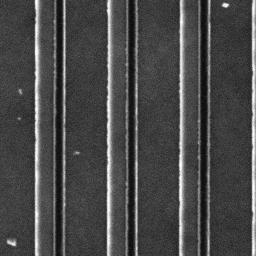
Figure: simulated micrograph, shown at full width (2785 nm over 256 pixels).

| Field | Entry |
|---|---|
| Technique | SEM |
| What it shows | lines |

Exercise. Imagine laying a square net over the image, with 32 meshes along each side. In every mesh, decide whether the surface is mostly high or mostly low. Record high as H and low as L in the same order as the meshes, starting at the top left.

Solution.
LLLLLHHHLLLLLLHHHLLLLLLHHHLLLLLL
LLLLLHHHLLLLLLHHHLLLLLLHHHLLLLLL
LLLLLHHHLLLLLLHHHLLLLLLHHHLLLLLL
LLLLHHHHLLLLLLHHHLLLLLLHHHLLLLLL
LLLLHHHHLLLLLLHHHLLLLLLHHHLLLLLL
LLLLHHHHLLLLLLHHHLLLLLLHHHLLLLLL
LLLLHHHHLLLLLLHHHLLLLLLHHHLLLLLL
LLLLLHHHLLLLLLHHHLLLLLLHHHLLLLLL
LLLLLHHHLLLLLLHHHLLLLLLHHHLLLLLL
LLLLHHHHLLLLLLHHHLLLLLLHHHLLLLLL
LLLLHHHHLLLLLLHHHLLLLLLHHHLLLLLL
LLLLHHHHLLLLLLHHHLLLLLLHHHLLLLLL
LLLLHHHHLLLLLHHHHLLLLLLHHHLLLLLL
LLLLHHHHLLLLLHHHHLLLLLLHHHLLLLLL
LLLLHHHHLLLLLLHHHLLLLLLHHHLLLLLL
LLLLHHHHLLLLLHHHHLLLLLLHHHLLLLLL
LLLLHHHHLLLLLHHHHLLLLLLHHHLLLLLL
LLLLLHHHLLLLLHHHHLLLLLLHHHLLLLLL
LLLLLHHHLLLLLHHHHLLLLLLHHHLLLLLL
LLLLHHHHLLLLLHHHHLLLLLLHHHLLLLLL
LLLLHHHHLLLLLLHHHLLLLLHHHHLLLLLL
LLLLHHHHLLLLLHHHHLLLLLHHHHLLLLLL
LLLLHHHHLLLLLHHHHLLLLLHHHHLLLLLL
LLLLHHHHLLLLLHHHHLLLLLHHHHLLLLLL
LLLLHHHHLLLLLHHHHLLLLLHHHHLLLLLL
LLLLHHHHLLLLLHHHHLLLLLLHHHLLLLLL
LLLLHHHHLLLLLHHHHLLLLLHHHHLLLLLL
LLLLHHHHLLLLLHHHHLLLLLHHHHLLLLLL
LLLLHHHHLLLLLHHHHLLLLLHHHHLLLLLL
LLLLHHHHLLLLLHHHHLLLLLHHHHLLLLLL
LLLLHHHHLLLLLHHHHLLLLLHHHHLLLLLL
LLLLHHHHLLLLLHHHHLLLLLHHHHLLLLLL